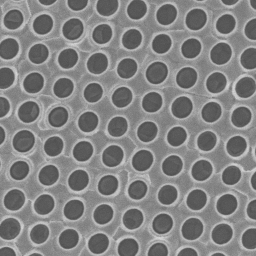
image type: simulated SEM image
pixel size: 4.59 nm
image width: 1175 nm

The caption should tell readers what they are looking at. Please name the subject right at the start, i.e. a regular array of holes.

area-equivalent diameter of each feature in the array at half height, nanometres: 97.2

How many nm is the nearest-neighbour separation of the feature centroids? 135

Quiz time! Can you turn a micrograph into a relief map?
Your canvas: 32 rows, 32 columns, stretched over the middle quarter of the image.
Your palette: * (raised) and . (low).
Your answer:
...***.....**.....***.....******
******.....**.....***.....***...
*******..****.....**......**....
.*************...****.....**....
..*******************....***....
..****...********************...
..***.....***....***************
..***.....**.....****...********
*****....***.....***.....***...*
******..****.....**......**.....
*************...***.....***.....
.*******************....***.....
.***....*******************.....
.***.....***...*************..**
.**......**.....****..**********
***.....***.....***....*********
****....***.....**......**....**
***********....***.....***.....*
*******************....***.....*
****..**************.*****....**
***....****...*************..***
**.....***.....****..***********
**.....**......***....**********
***....**......**......***...***
**********....***.....***.....**
**********...****.....**......**
***..*************...***.....***
**....*******************....***
*.....***....*******************
*.....***.....***...************
*.....**......**.....****...****
**...***.....***.....***....****